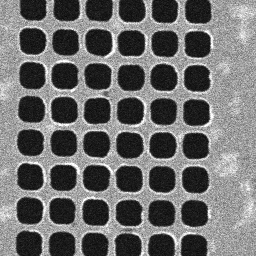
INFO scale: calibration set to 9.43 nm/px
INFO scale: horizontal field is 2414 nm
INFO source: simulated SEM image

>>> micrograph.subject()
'a regular array of holes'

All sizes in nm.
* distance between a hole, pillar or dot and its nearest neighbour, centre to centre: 310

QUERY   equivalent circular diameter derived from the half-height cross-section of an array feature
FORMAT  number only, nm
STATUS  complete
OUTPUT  266